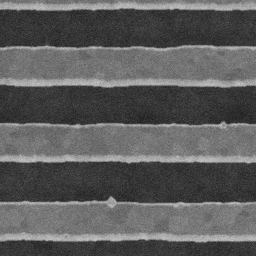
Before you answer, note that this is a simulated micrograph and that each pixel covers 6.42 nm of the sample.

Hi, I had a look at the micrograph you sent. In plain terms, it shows lines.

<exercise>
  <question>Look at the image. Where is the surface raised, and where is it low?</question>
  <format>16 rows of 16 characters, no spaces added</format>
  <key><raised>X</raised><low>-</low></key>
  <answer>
--XXXX-------XXX
----------------
----------------
XXXXXXXXXXXXXXXX
XXXXXXXXXXXXXXXX
----------------
----------------
----------------
XXXXXXXXXXXXXXXX
XXXXXXXXXXXXXXXX
----------------
----------------
----------------
XXXXXXXXXXXXXXXX
XXXXXXXXXXXXXXXX
----------------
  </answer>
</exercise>